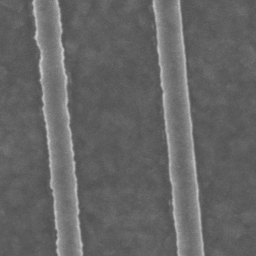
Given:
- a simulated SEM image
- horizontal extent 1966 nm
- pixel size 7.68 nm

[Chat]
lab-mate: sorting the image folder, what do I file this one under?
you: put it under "one or a few lines or trenches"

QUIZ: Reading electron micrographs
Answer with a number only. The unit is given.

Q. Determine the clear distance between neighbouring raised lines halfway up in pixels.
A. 95.9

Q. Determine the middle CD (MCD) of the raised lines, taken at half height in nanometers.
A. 187